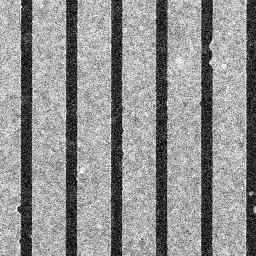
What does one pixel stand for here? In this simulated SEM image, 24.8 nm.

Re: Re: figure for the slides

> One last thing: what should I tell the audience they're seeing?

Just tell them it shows parallel lines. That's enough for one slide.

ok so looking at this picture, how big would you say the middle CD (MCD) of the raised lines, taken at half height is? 823 nanometers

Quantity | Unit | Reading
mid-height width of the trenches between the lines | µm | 0.294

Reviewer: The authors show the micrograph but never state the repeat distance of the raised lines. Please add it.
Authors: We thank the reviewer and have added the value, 1.12 um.